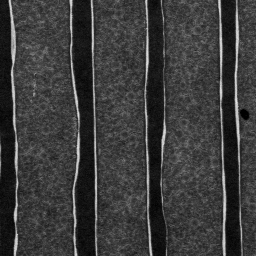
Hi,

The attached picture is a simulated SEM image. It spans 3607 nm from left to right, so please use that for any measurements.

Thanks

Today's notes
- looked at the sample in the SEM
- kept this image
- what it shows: one or a few lines or trenches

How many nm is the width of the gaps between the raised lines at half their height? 800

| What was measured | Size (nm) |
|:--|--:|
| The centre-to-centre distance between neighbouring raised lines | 1030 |